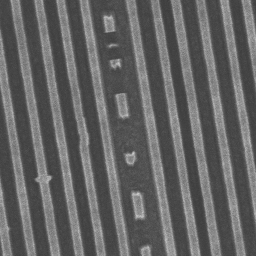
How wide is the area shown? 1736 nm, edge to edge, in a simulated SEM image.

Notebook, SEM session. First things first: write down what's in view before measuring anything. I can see parallel lines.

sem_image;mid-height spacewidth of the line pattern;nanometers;88.6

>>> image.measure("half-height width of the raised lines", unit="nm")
71.1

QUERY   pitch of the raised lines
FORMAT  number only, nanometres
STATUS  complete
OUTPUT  156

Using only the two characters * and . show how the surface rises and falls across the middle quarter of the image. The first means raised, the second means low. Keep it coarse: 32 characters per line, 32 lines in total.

***...***...**....***...***..***
.**....**.........***...***..***
.**....**.........***....**...**
.**....**..........**....**...**
.***...***.........**....**...**
.***...***.........**....**...**
..**...***.........***...***..**
..**....**....*....***...***..**
..**....**...**....***....**...*
..**....**...***....**....**...*
..***...***..***....**....**...*
..***...***..***....**....**...*
...**...***...**....***...**...*
...**...***...*.....***...***..*
...**....**.........***...***...
...***...**.........***...***...
...***...**..........**....**...
....**...***.........**....**...
*...**...***.........**....**...
*...**...***.........***...***..
*...**....**.........***...***..
*...**....**.........***....**..
*...**....**....**....**....**..
*...***...***..***....**....**..
**..***...***...**....**....**..
*...***...***.........***...***.
**...**....**.........***...***.
**...**....**.........***...***.
**...**....**..........**....**.
**...***...***.........**....**.
**...***...***.........**....**.
**...***...***.........***...***